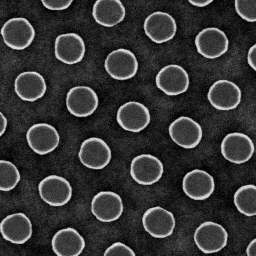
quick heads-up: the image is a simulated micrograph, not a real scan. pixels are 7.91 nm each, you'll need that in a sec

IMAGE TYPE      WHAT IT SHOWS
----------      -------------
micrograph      a regular array of raised bodies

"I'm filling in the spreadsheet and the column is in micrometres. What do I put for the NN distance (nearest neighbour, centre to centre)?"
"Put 0.426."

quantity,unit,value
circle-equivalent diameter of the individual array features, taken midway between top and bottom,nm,235